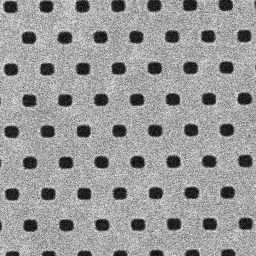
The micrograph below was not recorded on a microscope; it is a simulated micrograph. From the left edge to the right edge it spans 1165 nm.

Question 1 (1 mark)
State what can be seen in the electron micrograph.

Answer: a regular array of holes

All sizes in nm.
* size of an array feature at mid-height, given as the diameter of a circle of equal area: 63.3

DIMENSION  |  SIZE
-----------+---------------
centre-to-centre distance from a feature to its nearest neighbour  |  162 nanometres